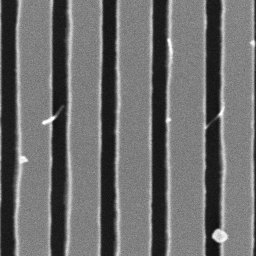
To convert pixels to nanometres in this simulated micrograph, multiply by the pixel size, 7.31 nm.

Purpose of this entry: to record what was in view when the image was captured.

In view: lines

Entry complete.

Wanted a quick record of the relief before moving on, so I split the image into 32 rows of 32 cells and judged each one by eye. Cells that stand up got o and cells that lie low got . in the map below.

..ooooo.ooooo..oooo..ooooo..oooo
..ooooo.ooooo..oooo..ooooo..oooo
..oooo..ooooo..oooo..ooooo..oooo
..oooo..ooooo..oooo..ooooo..oooo
..oooo..ooooo..oooo..ooooo..oooo
..oooo..ooooo..oooo..ooooo..oooo
..oooo..ooooo..oooo..ooooo..oooo
..oooo..ooooo..oooo..ooooo..oooo
..oooo..ooooo..oooo..ooooo..oooo
..oooo..ooooo..oooo..ooooo..oooo
..oooo..ooooo..oooo..ooooo..oooo
..oooo..ooooo..oooo..ooooo..oooo
..oooo..ooooo..oooo..ooooo..oooo
..oooo..ooooo..oooo..ooooo..oooo
..ooooo.ooooo..oooo..ooooo.ooooo
..oooo..ooooo..oooo..ooooo..oooo
..oooo..ooooo..oooo..ooooo..oooo
..oooo..ooooo..oooo..ooooo..oooo
..oooo..ooooo..oooo..ooooo..oooo
..oooo..ooooo..oooo..ooooo..oooo
..oooo..oooo..ooooo..ooooo..oooo
..oooo..oooo..ooooo..ooooo..oooo
..oooo..oooo..ooooo..ooooo..oooo
..oooo..oooo..ooooo..ooooo..oooo
..oooo..oooo...oooo..ooooo..oooo
..oooo..oooo..ooooo..ooooo..oooo
..oooo..oooo...oooo..ooooo..oooo
..oooo..oooo...oooo..ooooo..oooo
..oooo..oooo...oooo..ooooo.ooooo
..oooo..oooo...oooo..ooooo.ooooo
..oooo..oooo...oooo..ooooo.ooooo
..oooo..oooo..ooooo..ooooo..oooo